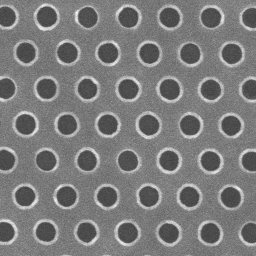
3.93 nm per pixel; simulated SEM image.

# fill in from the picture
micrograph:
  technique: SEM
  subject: a regular array of holes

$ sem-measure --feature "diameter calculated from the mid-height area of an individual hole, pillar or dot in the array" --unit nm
80.1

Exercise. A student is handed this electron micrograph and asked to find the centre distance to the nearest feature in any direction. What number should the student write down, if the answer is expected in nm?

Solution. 161